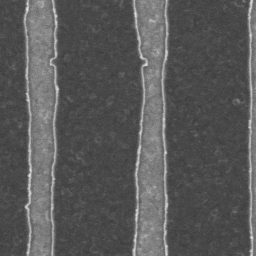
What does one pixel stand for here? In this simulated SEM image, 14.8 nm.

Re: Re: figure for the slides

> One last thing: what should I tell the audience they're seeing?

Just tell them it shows one or a few lines or trenches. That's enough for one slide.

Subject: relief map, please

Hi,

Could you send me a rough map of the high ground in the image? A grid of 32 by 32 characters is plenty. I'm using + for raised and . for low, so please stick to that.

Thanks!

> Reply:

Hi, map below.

++++...++++++++++....++++++++++.
+++....++++++++++....++++++++++.
+++....++++++++++....++++++++++.
+++....++++++++++....++++++++++.
+++....++++++++++....++++++++++.
+++....++++++++++....++++++++++.
+++....+++++++++++...++++++++++.
++++..++++++++++++...++++++++++.
+++....+++++++++++..+++++++++++.
+++....+++++++++++..+++++++++++.
+++....+++++++++++..+++++++++++.
+++....+++++++++++..+++++++++++.
++++...+++++++++++..+++++++++++.
++++...+++++++++++...++++++++++.
++++...+++++++++++..+++++++++++.
++++...+++++++++++..+++++++++++.
++++...+++++++++++..+++++++++++.
++++...+++++++++++..+++++++++++.
++++...+++++++++++...++++++++++.
++++...++++++++++....++++++++++.
++++...++++++++++....++++++++++.
++++...++++++++++....++++++++++.
++++...++++++++++....++++++++++.
++++...++++++++++....++++++++++.
++++...++++++++++....++++++++++.
++++...++++++++++....++++++++++.
+++...+++++++++++....++++++++++.
++++...++++++++++....++++++++++.
++++...++++++++++....++++++++++.
++++...++++++++++....+++++++++++
++++...++++++++++....+++++++++++
++++...++++++++++....++++++++++.